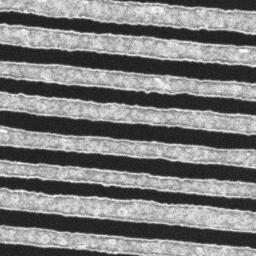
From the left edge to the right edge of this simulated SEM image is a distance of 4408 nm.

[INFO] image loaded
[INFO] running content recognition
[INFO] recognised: parallel lines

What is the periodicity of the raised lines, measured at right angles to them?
570 nm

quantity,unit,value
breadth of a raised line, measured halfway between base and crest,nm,298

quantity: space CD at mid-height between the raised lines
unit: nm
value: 270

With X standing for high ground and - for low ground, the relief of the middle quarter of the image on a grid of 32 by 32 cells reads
XXXXXXXXXXXXXXXXXXXXXXXXXXXXXXXX
------XXXXXXXXXXXXXXXXXXXXXXXXXX
-------------------XXXXXXXXXXXXX
------------------------------XX
--------------------------------
XXXXXXXXX-----------------------
XXXXXXXXXXXXXXXXXX-X------------
XXXXXXXXXXXXXXXXXXXXXXXXXXXXXXXX
XXXXXXXXXXXXXXXXXXXXXXXXXXXXXXXX
-----XXXXXXXXXXXXXXXXXXXXXXXXXXX
----------------XXXXXXXXXXXXXXXX
-------------------------X---XXX
--------------------------------
XXXXX---------------------------
XXXXXXXXXXXXXXX-----------------
XXXXXXXXXXXXXXXXXXXXXXXXXXXXX---
XXXXXXXXXXXXXXXXXXXXXXXXXXXXXXXX
XXXXXXXXXXXXXXXXXXXXXXXXXXXXXXXX
----------XXXXXXXXXXXXXXXXXXXXXX
-------------------X-XXXXXXXXXXX
--------------------------------
--------------------------------
XXXXXXXXXXXX--------------------
XXXXXXXXXXXXXXXXXXXXXX-XX-------
XXXXXXXXXXXXXXXXXXXXXXXXXXXXXXX-
XXXXXXXXXXXXXXXXXXXXXXXXXXXXXXXX
--------XXXXXXXXXXXXXXXXXXXXXXXX
------------------X--XXXXXXXXXXX
---------------------------XXXXX
XXXXX-X-------------------------
XXXXXXXXXXXXXXX-----------------
XXXXXXXXXXXXXXXXXXXXXXXX--------